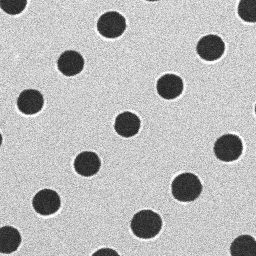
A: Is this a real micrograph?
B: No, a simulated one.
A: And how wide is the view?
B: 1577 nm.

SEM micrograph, a regular array of holes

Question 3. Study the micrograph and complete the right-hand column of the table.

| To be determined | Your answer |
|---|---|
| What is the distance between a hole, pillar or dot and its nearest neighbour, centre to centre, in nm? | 345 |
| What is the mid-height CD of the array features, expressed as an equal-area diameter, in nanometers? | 168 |